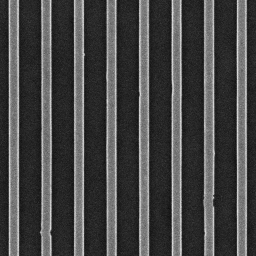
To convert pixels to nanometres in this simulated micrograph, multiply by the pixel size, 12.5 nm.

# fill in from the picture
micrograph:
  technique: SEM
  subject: parallel lines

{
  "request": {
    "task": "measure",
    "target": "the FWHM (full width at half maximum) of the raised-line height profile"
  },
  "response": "112 nanometers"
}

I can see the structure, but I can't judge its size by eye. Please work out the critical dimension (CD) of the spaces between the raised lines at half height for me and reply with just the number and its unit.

290 nanometers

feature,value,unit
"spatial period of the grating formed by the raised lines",405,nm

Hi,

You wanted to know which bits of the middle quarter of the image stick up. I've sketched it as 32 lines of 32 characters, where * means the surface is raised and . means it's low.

...**......**......**......**...
...**......**......**......**...
...**......**......**......**...
...**......**......**......**...
...**......**......**......**...
...**......**......**......**...
...**......**......**......**...
...**......**......**......**...
...**......**......**......**...
...**......**......**......**...
...**......**......**......**...
...**......**......**......**...
...**......**......**......**...
...**......**......**......**...
...**......**......**......**...
...**......**......**......**...
...**......**......**......**...
...**......**......**......**...
...**......**......**......**...
...**......**......**......**...
...**......**......**......**...
...**......**......**......**...
...**......**......**......**...
...**......**......**......**...
...**......**......**......**...
...**......**......**......**...
...**......**......**......**...
...**......**......**......**...
...**......**......**......**...
...**......**......**......**...
...**......**......**......**...
...**......**......**......**...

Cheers